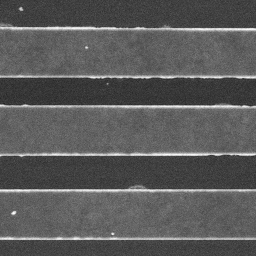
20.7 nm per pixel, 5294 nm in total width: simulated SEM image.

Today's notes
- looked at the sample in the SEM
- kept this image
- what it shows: lines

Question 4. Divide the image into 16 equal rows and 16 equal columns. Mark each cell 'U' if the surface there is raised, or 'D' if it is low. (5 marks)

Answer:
DDDDDDDDDDDDDDDD
DDDDDDDDDDDDDDDD
UUUUUUUUUUUUUUUU
UUUUUUUUUUUUUUUU
UUUUUUUUUUUUUUUU
DDDDDDDDDDDDDDDD
DDDDDDDDDDDDDDDD
UUUUUUUUUUUUUUUU
UUUUUUUUUUUUUUUU
UUUUUUUUUUUUUUUU
DDDDDDDDDDDDDDDD
DDDDDDDDDDDDDDDD
UUUUUUUUUUUUUUUU
UUUUUUUUUUUUUUUU
UUUUUUUUUUUUUUUU
DDDDDDDDDDDDDDDD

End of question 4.